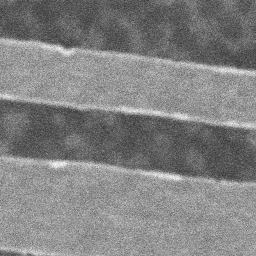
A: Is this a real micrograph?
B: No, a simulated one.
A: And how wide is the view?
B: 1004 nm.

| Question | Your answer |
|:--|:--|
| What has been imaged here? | one or a few lines or trenches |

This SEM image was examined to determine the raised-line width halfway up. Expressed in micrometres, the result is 0.224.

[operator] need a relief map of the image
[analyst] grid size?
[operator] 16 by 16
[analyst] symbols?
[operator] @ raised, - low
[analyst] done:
----------------
----------------
----------------
@@@@@@@@--------
@@@@@@@@@@@@@@@@
@@@@@@@@@@@@@@@@
---@@@@@@@@@@@@@
------------@@@@
----------------
----------------
@@@@@@@---------
@@@@@@@@@@@@@@@@
@@@@@@@@@@@@@@@@
@@@@@@@@@@@@@@@@
@@@@@@@@@@@@@@@@
@@@@@@@@@@@@@@@@